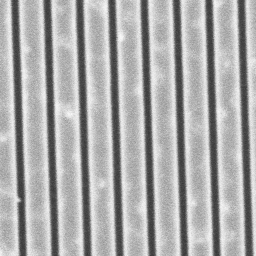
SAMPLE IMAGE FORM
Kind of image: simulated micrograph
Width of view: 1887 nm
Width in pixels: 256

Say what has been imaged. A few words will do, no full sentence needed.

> parallel lines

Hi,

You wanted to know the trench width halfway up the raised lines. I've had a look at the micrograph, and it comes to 62.6 nm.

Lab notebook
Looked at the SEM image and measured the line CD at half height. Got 173 nm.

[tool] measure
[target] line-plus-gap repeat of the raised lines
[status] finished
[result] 238 nm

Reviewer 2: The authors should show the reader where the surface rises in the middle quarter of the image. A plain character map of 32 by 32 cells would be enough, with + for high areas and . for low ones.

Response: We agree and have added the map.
+++...+++++...+++++...++++++..++
+++...+++++...+++++...++++++..++
+++...+++++...+++++...+++++...++
+++...++++++..+++++...+++++...++
+++...++++++..++++++..+++++...++
+++...+++++...++++++..++++++..++
+++...+++++...++++++..++++++..++
+++...+++++...++++++..++++++..++
+++...+++++...++++++..++++++..++
+++...+++++...++++++..++++++..++
++++..+++++...++++++..++++++..++
++++..++++++..++++++..++++++..++
++++..++++++..++++++..++++++..++
++++..++++++..++++++..++++++..++
++++..++++++..++++++..++++++..++
++++..++++++..++++++..++++++..++
++++..++++++..++++++..++++++..++
++++..++++++..++++++..++++++..++
++++..++++++..++++++..++++++..++
++++..++++++..++++++..++++++..++
++++..++++++..++++++..++++++..++
++++..++++++..++++++..++++++..++
++++..++++++..++++++..++++++..++
++++..++++++..++++++..++++++..++
++++..++++++..++++++..++++++..++
++++..++++++..++++++...+++++..++
++++..++++++..++++++...+++++...+
++++..++++++..++++++...+++++...+
++++..++++++..++++++...+++++...+
++++..++++++..++++++...+++++...+
++++..++++++..++++++...++++++..+
++++...+++++...+++++...+++++...+